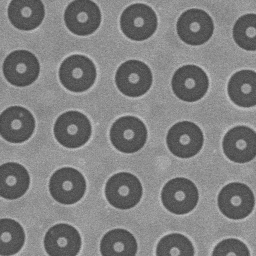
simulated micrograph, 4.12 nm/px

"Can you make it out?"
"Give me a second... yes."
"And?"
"an array of small figures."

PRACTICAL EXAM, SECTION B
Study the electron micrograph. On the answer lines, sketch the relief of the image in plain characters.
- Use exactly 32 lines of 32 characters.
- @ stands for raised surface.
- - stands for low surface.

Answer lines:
@----@@@@---@@@@--@@@@@@@@@@@@@@
@-----@@-----@@----@@@@---@@@@@@
@----@@@-----@@-----@@-----@@@--
@@---@@@----@@@-----@@-----@@---
@@@@@@@@@@-@@@@@---@@@----@@@---
@@@@@@@@@@@@@@@@@@@@@@@--@@@@@--
@@--@@@@@@@@@@@@@@@@@@@@@@@@@@@@
@----@@@----@@@@-@@@@@@@@@@@@@@@
-----@@-----@@@----@@@---@@@@@@@
-----@@-----@@-----@@@----@@@---
@---@@@@----@@-----@@-----@@----
@@@@@@@@@--@@@@---@@@@----@@----
@@@@@@@@@@@@@@@@@@@@@@@--@@@@---
@--@@@@@@@@@@@@@@@@@@@@@@@@@@@--
----@@@----@@@@--@@@@@@@@@@@@@@@
----@@@----@@@----@@@@--@@@@@@@@
----@@@-----@@----@@@----@@@----
@--@@@@----@@@----@@@-----@@----
@@@@@@@@--@@@@----@@@----@@@----
@@@@@@@@@@@@@@@@@@@@@@--@@@@----
--@@@@@@@@@@@@@@@@@@@@@@@@@@@@@@
----@@@---@@@@@-@@@@@@@@@@@@@@@@
----@@-----@@----@@@@---@@@@@@@@
----@@-----@@-----@@-----@@@---@
---@@@-----@@-----@@-----@@-----
@@@@@@@@-@@@@@---@@@-----@@-----
@@@@@@@@@@@@@@@@@@@@@---@@@@----
--@@@@@@@@@@@@@@@@@@@@@@@@@@@-@@
---@@@---@@@@@@@@@@@@@@@@@@@@@@@
---@@@----@@@----@@@---@@@@@@@@@
---@@-----@@-----@@@----@@@----@
--@@@@----@@-----@@-----@@-----@